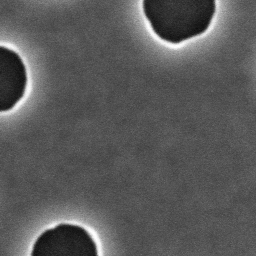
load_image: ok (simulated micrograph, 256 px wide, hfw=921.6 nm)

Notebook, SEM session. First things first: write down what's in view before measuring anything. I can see holes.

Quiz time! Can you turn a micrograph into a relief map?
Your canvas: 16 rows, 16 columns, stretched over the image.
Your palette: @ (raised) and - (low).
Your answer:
@@@@@@@@@----@@@
@@@@@@@@@----@@@
@@@@@@@@@@--@@@@
-@@@@@@@@@@@@@@@
--@@@@@@@@@@@@@@
--@@@@@@@@@@@@@@
-@@@@@@@@@@@@@@@
@@@@@@@@@@@@@@@@
@@@@@@@@@@@@@@@@
@@@@@@@@@@@@@@@@
@@@@@@@@@@@@@@@@
@@@@@@@@@@@@@@@@
@@@@@@@@@@@@@@@@
@@@@@@@@@@@@@@@@
@@@---@@@@@@@@@@
@@----@@@@@@@@@@